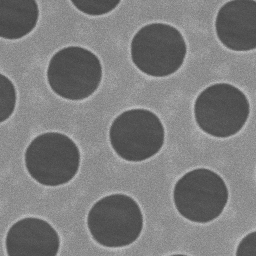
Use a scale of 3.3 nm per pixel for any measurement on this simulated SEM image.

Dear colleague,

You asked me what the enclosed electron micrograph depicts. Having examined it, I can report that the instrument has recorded holes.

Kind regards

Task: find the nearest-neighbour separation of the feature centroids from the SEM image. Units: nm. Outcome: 290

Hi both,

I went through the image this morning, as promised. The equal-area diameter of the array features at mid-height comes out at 180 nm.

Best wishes